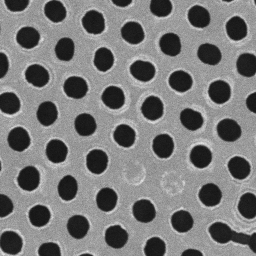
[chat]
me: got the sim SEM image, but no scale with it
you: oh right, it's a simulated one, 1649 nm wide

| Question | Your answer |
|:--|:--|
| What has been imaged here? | a regular array of holes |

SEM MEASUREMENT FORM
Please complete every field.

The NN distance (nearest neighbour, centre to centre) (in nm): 248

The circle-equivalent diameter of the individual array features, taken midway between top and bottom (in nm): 145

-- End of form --